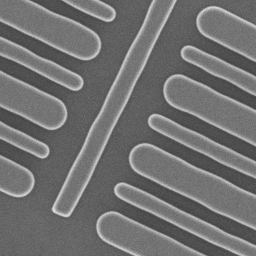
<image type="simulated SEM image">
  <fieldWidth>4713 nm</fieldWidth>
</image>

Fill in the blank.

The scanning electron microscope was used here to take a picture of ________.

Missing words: groups of lines, slits or small figures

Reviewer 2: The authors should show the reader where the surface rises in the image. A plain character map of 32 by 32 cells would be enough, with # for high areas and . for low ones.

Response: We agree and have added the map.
#####....####......###..........
######.....###....###....###....
#########....#....###....#####..
..#########.......##.....#######
....########.....###......######
##....######.....##.........####
####....####....###....###....##
.#####..........##.....#####...#
....####.......###.......#####..
#.....####.....##.....#....#####
###.....##....###....####....###
#####.........##.....######....#
#######......###.....########...
########.....##.......#########.
...#####....###....#.....#######
#....###....##.....###....######
###........###......####....####
####.......##.........####.....#
...###....###....###....####....
.....#....##....######....####..
##.......###....########....####
####.....###.....#########....##
####....###........#########....
####....###...###....#########..
..#....###.....####....#########
.......##........####....#######
.......##..........####....#####
............####.....####....###
............#######....####.....
............#########....####...
..............#########....####.
................#########....###